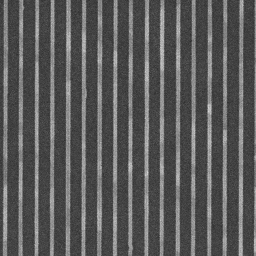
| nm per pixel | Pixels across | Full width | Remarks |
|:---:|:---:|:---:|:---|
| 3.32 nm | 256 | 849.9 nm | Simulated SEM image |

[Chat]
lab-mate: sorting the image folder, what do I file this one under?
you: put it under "parallel lines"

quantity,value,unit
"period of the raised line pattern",52.1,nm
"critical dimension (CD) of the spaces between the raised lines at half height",39.8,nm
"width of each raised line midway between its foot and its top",3.37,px